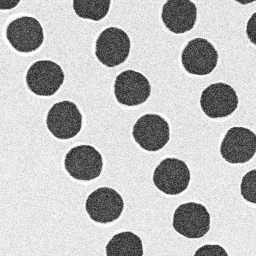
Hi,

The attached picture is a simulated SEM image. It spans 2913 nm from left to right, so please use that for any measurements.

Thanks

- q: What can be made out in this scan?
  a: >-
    a regular array of holes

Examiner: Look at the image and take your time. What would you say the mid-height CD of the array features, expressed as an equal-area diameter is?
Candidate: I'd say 434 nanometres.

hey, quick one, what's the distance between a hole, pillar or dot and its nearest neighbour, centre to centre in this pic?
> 541 nm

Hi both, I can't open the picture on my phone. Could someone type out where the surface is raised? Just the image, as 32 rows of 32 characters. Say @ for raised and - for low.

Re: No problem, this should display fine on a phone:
--@@@@@@@-----@@@@@@----@@@@@@-@
@@@@@@@@@----@@@@@@@-----@@@@@@@
@----@@@@@@-@@@@@@@@-----@@@@@@-
@----@@@@@@@@@-@@@@@@---@@@@@@@-
@----@@@@@@@----@@@@@@@@@@@@@@@-
@----@@@@@@@----@@@@@@@----@@@@@
@@--@@@@@@@@----@@@@@@@----@@@@@
@@@@@@@@@@@@----@@@@@@@----@@@@@
@@@@----@@@@@@@@@@@@@@@----@@@@@
@@@-----@@@@@@@---@@@@@@@@@@@@@@
@@@-----@@@@@@-----@@@@@@@--@@@@
@@@@---@@@@@@@-----@@@@@@----@@@
@@@@@@@@@@@@@@@---@@@@@@@-----@@
@@@@@@----@@@@@@@@@@@@@@@-----@@
@@@@@@----@@@@@@@@--@@@@@@---@@@
@@@@@@----@@@@@@@----@@@@@@@@@@@
@@@@@@----@@@@@@-----@@@@@@@----
@@@@@@@@@@@@@@@@@----@@@@@@@----
@@@@@@@@@---@@@@@@--@@@@@@@-----
@@@@@@@@-----@@@@@@@@@@@@@@@----
@@@@@@@@-----@@@@@@@---@@@@@@@@@
@@@@@@@@-----@@@@@@-----@@@@@@@-
@@@@@@@@@@--@@@@@@@-----@@@@@@--
@@@@@@@@@@@@--@@@@@@---@@@@@@@--
@@@@@@@@@@@----@@@@@@@@@@@@@@@--
@@@@@@@@@@@-----@@@@@@@--@@@@@@-
@@@@@@@@@@@----@@@@@@@----@@@@@@
@@@@@@@@@@@----@@@@@@@----@@@@@@
@@@@@@@@@@@@@@@@@@@@@@----@@@@@@
@@@@@@@@@@@@@@---@@@@@@--@@@@@@@
@@@@@@@@@@@@@-----@@@@@@@@@@@@@@
@@@@@@@@@@@@@-----@@@@@@----@@@@